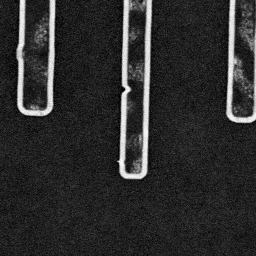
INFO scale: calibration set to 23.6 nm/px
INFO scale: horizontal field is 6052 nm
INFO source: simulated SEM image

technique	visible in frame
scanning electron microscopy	one or a few lines or trenches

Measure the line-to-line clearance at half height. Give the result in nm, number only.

1950